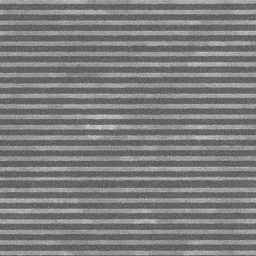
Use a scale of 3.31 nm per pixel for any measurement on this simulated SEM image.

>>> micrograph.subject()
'parallel lines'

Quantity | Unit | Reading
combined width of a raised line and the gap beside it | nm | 34.7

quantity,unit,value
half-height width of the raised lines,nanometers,13.2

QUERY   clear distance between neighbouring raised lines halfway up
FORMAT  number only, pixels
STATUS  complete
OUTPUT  6.5